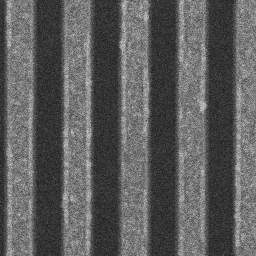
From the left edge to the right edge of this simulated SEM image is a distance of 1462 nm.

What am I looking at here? parallel lines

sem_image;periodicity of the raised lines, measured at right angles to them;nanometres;327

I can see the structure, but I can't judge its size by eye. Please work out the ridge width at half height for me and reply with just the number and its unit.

161 nanometres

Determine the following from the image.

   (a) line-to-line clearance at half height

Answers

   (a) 167 nanometers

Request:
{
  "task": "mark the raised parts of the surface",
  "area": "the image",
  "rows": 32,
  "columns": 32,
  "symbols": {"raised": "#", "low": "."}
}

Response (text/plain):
.###....###....####...####....##
.###....###....####...####....##
.###....###....####...####....##
.###....###....####...####....##
.###....###....####...####....##
.###....###....####...####....##
.###....###....####...####....##
.###....###....####...####....##
.###....###....####...####....##
.###....###....####...####....##
.###....###....####...####....##
.###....###....####...####....##
.###....###....####...####....##
.###....###....####...####....##
.###....###....####...####....##
.###....###....####...####....##
.###....###....####...####....##
.###....###....####...####....##
.###....###....###....####....##
.###....###....###....####....##
.###....###....###....####...###
.###....###....####...####...###
.###....###....####...####...###
.###....###....####...####...###
.###....###....####...####...###
.###....###....####...####...###
.###....###....####...####...###
.###....###....####...####...###
.###....###....####...####...###
.###....###....####...####...###
.###....###....###....####...###
.###....###....###....####...###